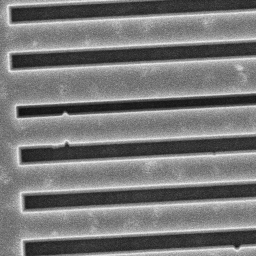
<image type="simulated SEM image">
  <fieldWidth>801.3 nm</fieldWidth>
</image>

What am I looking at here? parallel lines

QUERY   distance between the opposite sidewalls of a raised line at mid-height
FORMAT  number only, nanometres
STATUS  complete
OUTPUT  94.5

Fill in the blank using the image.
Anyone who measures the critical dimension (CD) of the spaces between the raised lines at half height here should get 53.1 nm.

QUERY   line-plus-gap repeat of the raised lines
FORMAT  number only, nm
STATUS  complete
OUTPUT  147